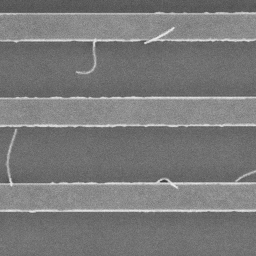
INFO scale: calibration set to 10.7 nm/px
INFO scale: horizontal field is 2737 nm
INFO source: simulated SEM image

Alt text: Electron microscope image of lines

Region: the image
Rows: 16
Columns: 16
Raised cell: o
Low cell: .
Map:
................
oooooooooooooooo
oooooooooooooooo
................
................
................
oooooooooooooooo
oooooooooooooooo
................
................
................
o..ooooooooooooo
oooooooooooooooo
................
................
................